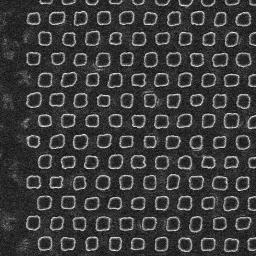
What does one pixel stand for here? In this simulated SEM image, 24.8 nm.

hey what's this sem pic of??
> a regular array of raised bodies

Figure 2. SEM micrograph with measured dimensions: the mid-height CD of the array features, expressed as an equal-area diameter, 0.349 micrometres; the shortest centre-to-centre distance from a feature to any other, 22.8 pixels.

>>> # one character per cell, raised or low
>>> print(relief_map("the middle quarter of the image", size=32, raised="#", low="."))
........##..........###....#....
................................
###...##....##.........##....###
###...###..###...###...###...###
###...###..###...###...###...###
#..........###.........#.....##.
................................
...##...........................
...###..###...###...###...###...
...###..###...###...###...###...
...##.....#....##....##...##....
................................
................................
###...###..###...###...###...###
###...##....##...###...###..####
##....##....##...###...###..###.
................................
................................
...###...###..###...###...###...
..####..####..###...###...###...
...###...##...###...###...###...
................................
................................
###...##...####..###...###...###
###..###...####..###...###...###
###..###...###...###...###...###
................................
................................
...##...###...###...###...###...
..###...###...###...###...###..#
..###...###...###...###...##...#
................................